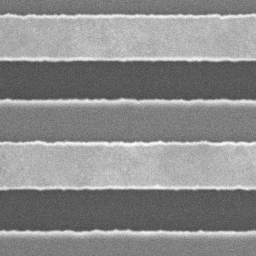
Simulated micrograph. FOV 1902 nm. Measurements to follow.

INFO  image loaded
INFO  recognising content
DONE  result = lines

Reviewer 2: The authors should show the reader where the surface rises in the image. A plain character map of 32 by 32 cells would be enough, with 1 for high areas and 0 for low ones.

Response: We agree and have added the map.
11111111111111111111111111111111
11111111111111111111111111111111
11111111111111111111111111111111
11111111111111111111111111111111
11111111111111111111111111111111
11111111111111111111111111111111
11111111111111111111111111111111
11111111111101111111111111111111
00000000000000000000000000000000
00000000000000000000000000000000
00000000000000000000000000000000
00000000000000000000000000000000
00000000000000010000000000000000
11111111111111111111111111111111
11111111111111111111111111111111
11111111111111111111111111111111
11111111111111111111111111111111
11111111111111111111111111111111
11111111111111111111111111111111
11111111111111111111111111111111
11111111111111111111111111111111
11111111111111111111111111111111
11111111111111111111111111111111
11111111111111111111111111111111
00000000000000000000000000000000
00000000000000000000000000000000
00000000000000000000000000000000
00000000000000000000000000000000
00000000000000000000000000000000
11111111111111111111111111111111
11111111111111111111111111111111
11111111111111111111111111111111